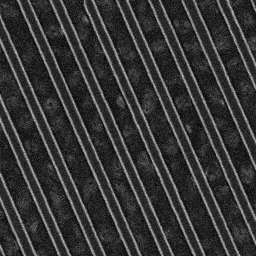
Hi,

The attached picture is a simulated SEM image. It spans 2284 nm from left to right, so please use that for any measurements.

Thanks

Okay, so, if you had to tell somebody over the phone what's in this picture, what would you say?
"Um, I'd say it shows parallel lines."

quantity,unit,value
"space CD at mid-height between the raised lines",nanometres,185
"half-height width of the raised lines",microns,0.0848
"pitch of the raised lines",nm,274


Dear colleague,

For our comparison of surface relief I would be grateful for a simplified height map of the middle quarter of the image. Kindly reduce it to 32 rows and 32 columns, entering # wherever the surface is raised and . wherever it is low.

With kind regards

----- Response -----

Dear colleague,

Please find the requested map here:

....##......##......###.....###.
....###.....###......##......###
.....##......##......###......##
.....###.....###......##......##
......##......##......###.....##
#.....###.....###......##......#
#......##......##......###.....#
##.....##......##......###.....#
##.....###.....###......##......
##......##......##......###.....
###.....###.....###......##.....
###......##......##......###....
.###.....###.....###......##....
.###......##......##......###...
..###.....###.....###.....###...
..###.....###.....###......###..
...##......##......##......###..
...###.....###.....###......##..
....##......##......##......###.
....###.....###.....###......##.
....###......##......##......###
.....###.....###.....###......##
.....###......##.....###......##
......###.....###.....###......#
......###.....###.....###......#
.......##......##......##......#
#......###.....###.....###......
#.......##......##......##......
##......###.....###.....###.....
##......###......##......##.....
###......###.....###.....###....
###......###......##......##....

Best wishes